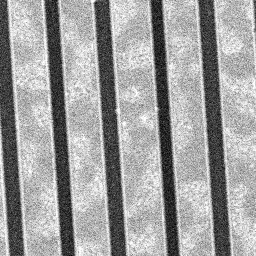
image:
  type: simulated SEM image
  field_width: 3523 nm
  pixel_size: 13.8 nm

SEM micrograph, parallel lines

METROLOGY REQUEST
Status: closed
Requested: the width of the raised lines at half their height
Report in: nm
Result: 479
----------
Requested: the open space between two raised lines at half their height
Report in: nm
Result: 240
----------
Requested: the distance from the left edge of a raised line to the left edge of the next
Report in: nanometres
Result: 706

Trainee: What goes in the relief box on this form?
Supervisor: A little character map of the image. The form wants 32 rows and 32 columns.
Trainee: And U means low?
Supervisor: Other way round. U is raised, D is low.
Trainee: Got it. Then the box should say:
DUUUUDDUUUUUDDUUUUUDUUUUUDDUUUUD
DUUUUUDDUUUUDDUUUUUDDUUUUDDUUUUU
DUUUUUDDUUUUDDUUUUUDDUUUUDDUUUUU
DUUUUUDDUUUUDDUUUUUDDUUUUDDUUUUU
DUUUUUDDUUUUDDUUUUUDDUUUUDDUUUUU
DDUUUUDDUUUUDDUUUUUDDUUUUDDUUUUU
DDUUUUDDUUUUDDUUUUUDDUUUUDDUUUUU
DDUUUUDDUUUUDDUUUUUDDUUUUDDUUUUU
DDUUUUDDUUUUDDUUUUUDDUUUUDDUUUUU
DDUUUUDDUUUUDDUUUUUDDUUUUDDDUUUU
DDUUUUDDUUUUDDUUUUUDDUUUUDDDUUUU
DDUUUUDDUUUUDDDUUUUDDUUUUDDDUUUU
DDUUUUDDUUUUDDDUUUUDDUUUUDDDUUUU
DDUUUUDDUUUUDDDUUUUUDUUUUDDDUUUU
DDUUUUDDUUUUUDDUUUUUDUUUUUDDUUUU
DDUUUUDDUUUUUDDUUUUUDDUUUUDDUUUU
DDUUUUUDDUUUUDDUUUUUDDUUUUDDUUUU
DDUUUUUDDUUUUDDUUUUUDDUUUUDDUUUU
DDUUUUUDDUUUUDDUUUUUDDUUUUDDUUUU
DDUUUUUDDUUUUDDUUUUUDDUUUUDDUUUU
DDUUUUUDDUUUUDDUUUUUDDUUUUDDUUUU
DDUUUUUDDUUUUDDUUUUUDDUUUUDDUUUU
DDDUUUUDDUUUUDDUUUUUDDUUUUDDUUUU
DDDUUUUDDUUUUDDUUUUUDDUUUUDDUUUU
UDDUUUUDDUUUUDDUUUUUDDUUUUDDDUUU
UDDUUUUDDUUUUDDUUUUUDDUUUUDDDUUU
UDDUUUUDDUUUUDDDUUUUDDUUUUDDDUUU
UDDUUUUDDUUUUDDDUUUUUDUUUUDDDUUU
UDDUUUUDDUUUUUDDUUUUUDUUUUUDDUUU
UDDUUUUDDUUUUUDDUUUUUDUUUUUDDUUU
UDDUUUUUDUUUUUDDUUUUUDDUUUUDDUUU
UDDUUUUUDUUUUUDDUUUUUDDUUUUDDUUU